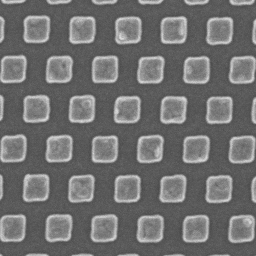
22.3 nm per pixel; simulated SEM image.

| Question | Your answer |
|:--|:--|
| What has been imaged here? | a regular array of raised bodies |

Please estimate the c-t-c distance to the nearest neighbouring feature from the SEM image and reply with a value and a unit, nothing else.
1.01 µm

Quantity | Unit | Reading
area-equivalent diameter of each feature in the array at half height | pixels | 27.3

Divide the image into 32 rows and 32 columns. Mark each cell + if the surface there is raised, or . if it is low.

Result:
................................
................................
...+++...+++...++....++...+++...
...+++...+++...+++..+++...+++...
...+++...+++...+++..+++...+++...
................................
................................
+++...+++...+++...++....++...+++
+++...+++...+++..+++...+++...+++
+++...+++...+++..+++...+++...+++
................................
................................
...+++...+++...++...+++...+++...
...+++...+++..+++...+++...+++...
...+++...+++..+++...+++...+++...
................................
................................
+++...+++...+++...++...+++...+++
+++...+++...+++..+++...+++...+++
+++...+++...+++..+++...+++...+++
................................
................................
...+++...+++...++...+++...+++...
...+++...+++...++...+++...+++...
...+++...+++..+++...+++...+++...
................................
................................
+++...+++...+++...++...+++...+++
+++...+++...+++..+++...+++...+++
+++...+++..+++...+++...+++...+++
................................
................................